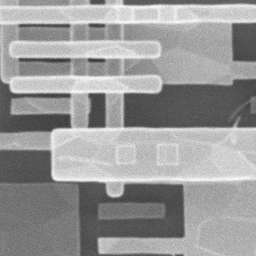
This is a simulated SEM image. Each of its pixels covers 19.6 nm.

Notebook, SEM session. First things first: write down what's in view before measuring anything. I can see wiring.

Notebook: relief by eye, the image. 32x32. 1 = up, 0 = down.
11000000011001110000000000000000
11111111111111111111111111111111
11111111111111111111111111111111
11000000011001100000000000000000
11000000011001100000000000000000
11111111111111111111000000000000
11111111111111111111000000000000
11000000011001110000000000000000
11000000011001100000000000000000
11100000111001110000000000000000
01111111111111111111000000000000
00111111111001110011000000000000
00000000011001100000000000000000
00000000011001100000000000000000
00000000011001100000000000000000
00000000011001100000000000000000
00000001111111111111111111111111
00000001111111111111111111111111
00000001111111111111111111111111
00000001111111111111111111111111
00000001111111111111111111111111
00000001111111111111111111111111
00000000111111111110000000000000
00000000000001100000000000000000
00000000000000100000000000000000
00000000000000000000000000000000
00000000000000000000000000000000
00000000000000000000000000000000
00000000000000000000000000000000
00000000000000000000000000000000
00000000000000000000000000000000
00000000000000000000000000000000